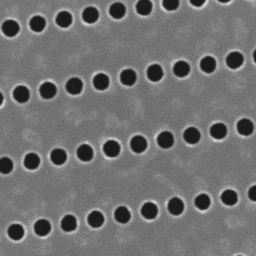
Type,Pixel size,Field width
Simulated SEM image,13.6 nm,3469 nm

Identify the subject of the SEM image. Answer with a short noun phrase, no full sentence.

a regular array of holes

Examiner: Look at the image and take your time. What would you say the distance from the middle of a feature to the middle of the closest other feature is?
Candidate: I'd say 364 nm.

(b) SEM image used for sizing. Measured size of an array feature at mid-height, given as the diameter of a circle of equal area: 241 nm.